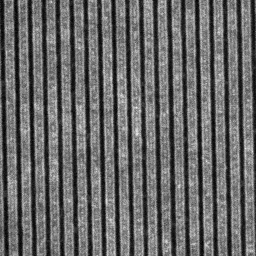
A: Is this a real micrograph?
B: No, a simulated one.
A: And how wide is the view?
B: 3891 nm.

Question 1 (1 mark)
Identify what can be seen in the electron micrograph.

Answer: parallel lines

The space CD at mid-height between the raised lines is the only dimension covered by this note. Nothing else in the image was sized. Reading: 89.3 nanometers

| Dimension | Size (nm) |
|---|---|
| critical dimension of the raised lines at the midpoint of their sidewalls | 122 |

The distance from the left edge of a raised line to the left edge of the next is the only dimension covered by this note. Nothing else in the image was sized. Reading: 212 nanometres